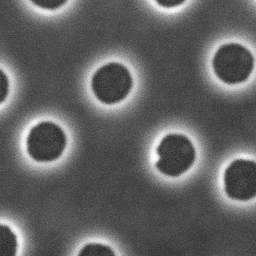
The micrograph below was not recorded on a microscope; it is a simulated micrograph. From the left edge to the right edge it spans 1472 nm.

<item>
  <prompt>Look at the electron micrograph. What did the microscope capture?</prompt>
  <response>holes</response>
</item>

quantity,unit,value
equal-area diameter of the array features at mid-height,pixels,42.5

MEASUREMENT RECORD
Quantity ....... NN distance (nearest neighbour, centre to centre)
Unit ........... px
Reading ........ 91.8